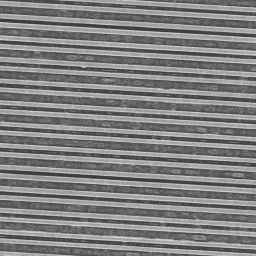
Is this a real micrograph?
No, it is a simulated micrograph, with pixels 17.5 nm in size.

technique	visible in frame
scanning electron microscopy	parallel lines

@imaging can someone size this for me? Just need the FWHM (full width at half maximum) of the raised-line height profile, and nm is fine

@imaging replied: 76.3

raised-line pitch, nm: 188